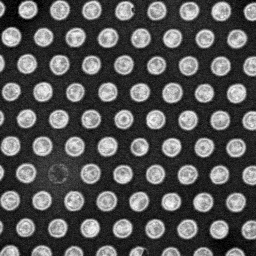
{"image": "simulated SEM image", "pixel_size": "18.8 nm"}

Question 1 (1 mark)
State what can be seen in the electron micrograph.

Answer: a regular array of raised bodies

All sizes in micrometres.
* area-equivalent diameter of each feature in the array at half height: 0.338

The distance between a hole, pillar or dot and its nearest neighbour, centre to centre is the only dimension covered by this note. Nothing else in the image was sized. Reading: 590 nm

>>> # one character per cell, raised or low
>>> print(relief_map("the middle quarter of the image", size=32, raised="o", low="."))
o....oooo....oooo....oooo....ooo
o....ooo.....oooo....oooo....ooo
..............................oo
................................
................................
..oo.....oooo.....ooo.....ooo...
.oooo....oooo....oooo....oooo...
.oooo....oooo....oooo....oooo...
.ooo.....oooo....oooo....oooo...
...........................o....
................................
................................
o....ooo.....oooo....oooo....ooo
o....oooo....oooo....oooo....ooo
o....oooo....oooo....oooo....ooo
.....ooo.....ooo.....ooo.....ooo
................................
................................
..o........o....................
.oooo....oooo....ooo.....oooo...
ooooo....oooo....oooo....oooo...
.oooo....oooo....oooo....oooo...
..oo.....ooo......oo......oo....
................................
................................
......oo........................
.....oooo....oooo....oooo....ooo
.....oooo....oooo....oooo....ooo
.....oooo....oooo....oooo....ooo
......oo......oo......oo.....ooo
................................
................................